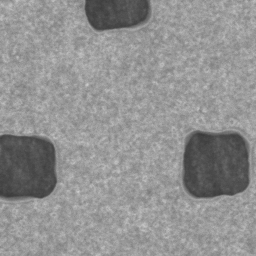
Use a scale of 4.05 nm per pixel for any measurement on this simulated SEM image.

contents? holes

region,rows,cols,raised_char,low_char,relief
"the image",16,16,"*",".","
*****....*******
******...*******
****************
****************
****************
****************
****************
****************
..**********...*
...*********....
...********.....
...********....*
****************
****************
****************
****************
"